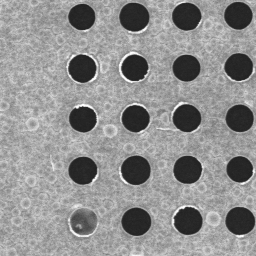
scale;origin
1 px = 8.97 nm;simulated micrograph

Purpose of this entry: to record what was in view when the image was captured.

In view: a regular array of holes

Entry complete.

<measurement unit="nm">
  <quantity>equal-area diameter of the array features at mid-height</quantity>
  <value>254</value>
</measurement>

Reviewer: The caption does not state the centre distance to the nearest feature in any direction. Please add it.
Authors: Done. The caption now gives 458 nm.